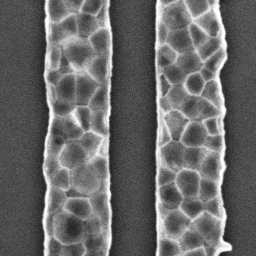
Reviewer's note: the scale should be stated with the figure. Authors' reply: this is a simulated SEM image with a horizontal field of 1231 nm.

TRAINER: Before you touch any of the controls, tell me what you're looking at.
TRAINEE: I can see one or a few lines or trenches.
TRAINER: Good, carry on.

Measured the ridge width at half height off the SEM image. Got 308 nm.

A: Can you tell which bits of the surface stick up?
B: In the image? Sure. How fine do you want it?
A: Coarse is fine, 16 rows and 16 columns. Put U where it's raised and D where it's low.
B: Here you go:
DDDUUUUDDDUUUUDD
DDDUUUUDDDUUUUDD
DDDUUUUDDDUUUUDD
DDDUUUUDDDUUUUDD
DDDUUUUDDDUUUUDD
DDDUUUUDDDUUUUDD
DDDUUUUDDDUUUUDD
DDDUUUUDDDUUUUDD
DDDUUUUDDDUUUUDD
DDDUUUUDDDUUUUDD
DDDUUUUDDDUUUUDD
DDDUUUUDDDUUUUDD
DDDUUUUDDDUUUUDD
DDDUUUUDDDUUUUDD
DDDUUUUDDDUUUUDD
DDDUUUUDDDUUUUDD